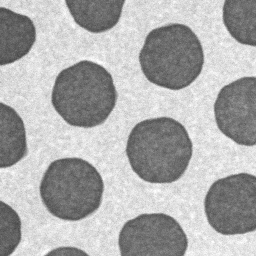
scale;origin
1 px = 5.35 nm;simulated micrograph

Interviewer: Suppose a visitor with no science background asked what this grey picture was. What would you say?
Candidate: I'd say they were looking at holes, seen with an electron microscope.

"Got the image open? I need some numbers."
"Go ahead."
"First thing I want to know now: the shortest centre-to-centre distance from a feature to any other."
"501 nm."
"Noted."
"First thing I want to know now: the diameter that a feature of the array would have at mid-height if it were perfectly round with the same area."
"350 nm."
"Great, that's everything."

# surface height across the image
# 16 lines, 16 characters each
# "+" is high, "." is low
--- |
++++....++++++..
..+++..+++++++..
..+++++++...+++.
.++++++++....+++
++++...++....+++
+++....+++.+++..
+++....++++++...
.+++...++..++...
..++++++....++..
..++++++....++++
+++...++....++++
+++...+++++++...
+++...+++++++...
.++..++++..++...
.+++++++....++..
.+++.++.....++++